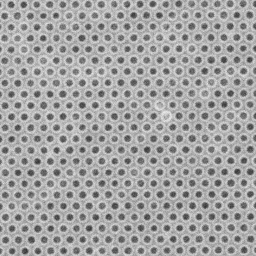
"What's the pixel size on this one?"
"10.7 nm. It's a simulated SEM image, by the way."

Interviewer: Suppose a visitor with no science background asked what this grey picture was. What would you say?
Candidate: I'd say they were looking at a regular array of holes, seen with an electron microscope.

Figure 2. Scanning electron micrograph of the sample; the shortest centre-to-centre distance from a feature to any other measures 134 nanometers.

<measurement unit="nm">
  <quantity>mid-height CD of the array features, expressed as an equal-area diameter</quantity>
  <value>85.3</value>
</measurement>